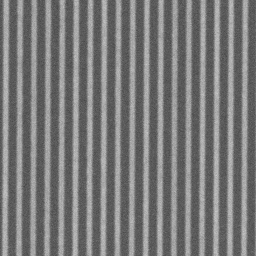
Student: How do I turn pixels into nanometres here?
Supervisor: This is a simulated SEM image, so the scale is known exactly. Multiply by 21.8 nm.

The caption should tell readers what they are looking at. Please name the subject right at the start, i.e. parallel lines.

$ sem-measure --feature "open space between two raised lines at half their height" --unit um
0.245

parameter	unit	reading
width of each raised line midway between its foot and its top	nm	62.6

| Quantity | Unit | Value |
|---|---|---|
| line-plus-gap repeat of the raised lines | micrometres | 0.306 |